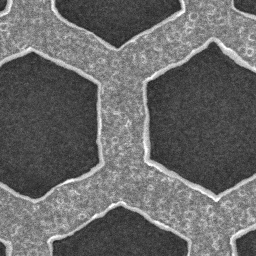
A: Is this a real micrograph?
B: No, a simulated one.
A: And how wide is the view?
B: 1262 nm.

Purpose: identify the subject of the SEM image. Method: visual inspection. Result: holes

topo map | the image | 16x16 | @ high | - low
@@@--------@@@@-
@@@@------@@@@@@
@@@@@@--@@@@@@@@
@--@@@@@@@@@---@
-----@@@@@------
------@@@-------
------@@@-------
------@@@-------
------@@@-------
------@@@-------
------@@@@------
----@@@@@@@@---@
@@@@@@@@@@@@@@@@
@@@@@@---@@@@@@@
@@@@@------@@@@-
@@@---------@@@-